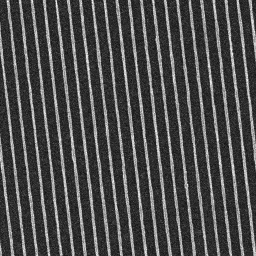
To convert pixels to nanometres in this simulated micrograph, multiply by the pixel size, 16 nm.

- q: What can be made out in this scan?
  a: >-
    parallel lines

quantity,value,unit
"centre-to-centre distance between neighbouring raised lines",192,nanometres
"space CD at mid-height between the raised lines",0.157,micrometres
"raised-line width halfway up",35.8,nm